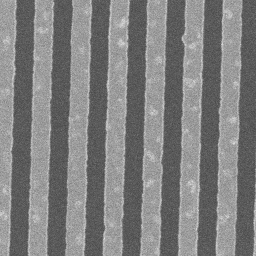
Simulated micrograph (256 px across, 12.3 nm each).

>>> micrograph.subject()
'parallel lines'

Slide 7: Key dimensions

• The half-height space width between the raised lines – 242 nm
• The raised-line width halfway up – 229 nm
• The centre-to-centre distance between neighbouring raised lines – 463 nm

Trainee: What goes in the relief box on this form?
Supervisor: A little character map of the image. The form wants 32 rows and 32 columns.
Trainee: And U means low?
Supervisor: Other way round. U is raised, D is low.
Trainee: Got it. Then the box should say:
UUDDUUUDDUUDDDUUDDUUUDDUUDDDUUDD
UUDDUUUDDUUDDDUUDDUUUDDUUDDDUUDD
UUDDUUUDDUUDDDUUDDUUUDDUUDDDUUDD
UUDDUUUDDUUDDDUUDDUUUDDUUDDDUUDD
UUDDUUUDDUUDDDUUDDUUUDDUUDDDUUDD
UUDDUUUDDUUDDDUUDDUUUDDUUDDDUUDD
UUDDUUUDDUUDDDUUDDUUUDDUUDDDUUDD
UUDDUUDDDUUDDDUUDDUUUDDUUDDDUUDD
UUDDUUDDDUUDDDUUDDUUDDDUUDDDUUDD
UUDDUUDDDUUDDDUUDDUUUDDUUDDDUUDD
UUDDUUDDDUUDDUUUDDUUUDDUUDDDUUDD
UUDDUUDDDUUDDDUUDDUUDDDUUDDDUUDD
UUDDUUDDDUUDDDUUDDUUDDDUUDDDUUDD
UUDDUUDDDUUDDUUUDDUUDDDUUDDUUUDD
UUDDUUDDDUUDDUUUDDUUDDDUUDDUUUDD
UUDDUUDDDUUDDUUUDDUUDDDUUDDUUUDD
UDDDUUDDDUUDDUUUDDUUDDDUUDDUUUDD
UUDDUUDDDUUDDUUUDDUUDDDUUDDUUUDD
UDDDUUDDDUUDDUUUDDUUDDDUUDDUUUDD
UDDDUUDDDUUDDUUUDDUUDDDUUDDUUUDD
UDDDUUDDDUUDDUUDDDUUDDDUUDDUUUDD
UDDDUUDDDUUDDUUDDDUUDDDUUDDUUUDD
UDDDUUDDDUUDDUUDDDUUDDDUUDDUUUDD
UDDDUUDDUUUDDUUDDDUUDDDUUDDUUUDD
UDDDUUDDUUUDDUUDDDUUDDDUUDDUUUDD
UDDDUUDDUUUDDUUDDDUUDDUUUDDUUDDD
UDDDUUDDUUUDDUUDDDUUDDUUUDDUUUDD
UDDDUUDDUUUDDUUDDDUUDDDUUDDUUUDD
UDDDUUDDUUUDDUUDDDUUDDUUUDDUUDDD
UDDDUUDDUUUDDUUDDDUUDDUUUDDUUDDD
UDDDUUDDUUUDDUUDDDUUDDUUUDDUUDDD
UDDDUUDDUUDDDUUDDDUUDDUUUDDUUDDD